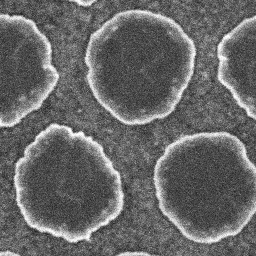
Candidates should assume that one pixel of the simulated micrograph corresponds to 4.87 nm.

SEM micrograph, raised bodies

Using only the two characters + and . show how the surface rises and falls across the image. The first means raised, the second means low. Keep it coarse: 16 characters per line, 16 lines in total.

................
++.....++++....+
+++...++++++..++
+++...++++++..++
+++...++++++..++
+++...+++++...++
++....+++++....+
+.......+.......
..+++.......++..
..++++....+++++.
.++++++...++++++
.++++++...++++++
.+++++++..++++++
..+++++....+++++
...+++......+++.
................